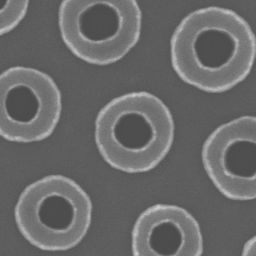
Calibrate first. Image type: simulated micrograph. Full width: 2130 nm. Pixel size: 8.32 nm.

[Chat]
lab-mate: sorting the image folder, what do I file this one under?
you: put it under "ring-shaped raised bodies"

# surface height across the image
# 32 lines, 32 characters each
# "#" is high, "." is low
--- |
.##.....####.####...............
###.....##....###........####...
##......##.....##......#######..
#.......##.....##.....#########.
........###...###.....###....###
........#########.....##.....###
.........#######......##.....###
...........###........###....###
......................#########.
######.................########.
#######.................#####...
#...###.........................
#....##.......######............
#....##......########...........
#...###.....###...###...........
#######.....###....###......####
######......##.....###.....#####
.###........###....##.....######
............####.####.....###...
.............#######......##....
..............#####.......##....
..........................###...
.....####..................#####
...#######.................#####
...########.................####
..###....##.....................
..###....##.......#####.........
..###....##......#######........
...###..###......##...###.......
...#######.......##....##.......
....#####........##....##......#
.................###..###......#